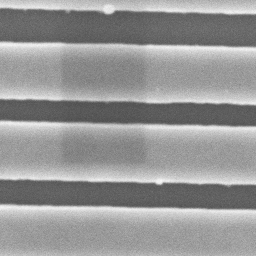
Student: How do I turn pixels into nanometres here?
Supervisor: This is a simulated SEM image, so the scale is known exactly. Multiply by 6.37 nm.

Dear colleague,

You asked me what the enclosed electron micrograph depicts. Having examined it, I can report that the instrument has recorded lines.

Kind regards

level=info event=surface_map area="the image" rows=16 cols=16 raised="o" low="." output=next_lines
oooooooooooooooo
................
................
oooooooooooooooo
oooooooooooooooo
oooooooooooooooo
...............o
................
oooooooooooooooo
oooooooooooooooo
oooooooooooooooo
................
................
oooooooooooooooo
oooooooooooooooo
oooooooooooooooo